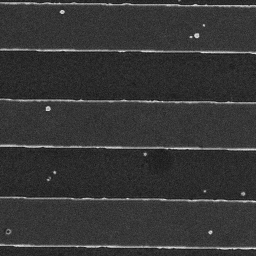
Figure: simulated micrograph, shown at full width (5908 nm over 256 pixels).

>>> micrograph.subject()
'lines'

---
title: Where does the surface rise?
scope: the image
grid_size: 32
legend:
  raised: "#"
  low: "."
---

########.#......................
################################
################################
################################
################################
################################
.........................#######
................................
................................
................................
................................
................................
##..............................
################################
################################
################################
################################
################################
......................##########
................................
................................
................................
................................
................................
................................
################################
################################
################################
################################
################################
################################
................................